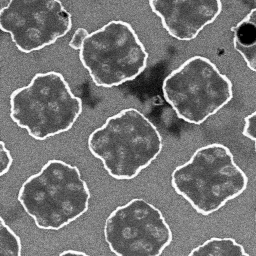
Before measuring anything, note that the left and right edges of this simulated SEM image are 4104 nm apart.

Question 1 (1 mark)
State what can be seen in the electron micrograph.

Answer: raised bodies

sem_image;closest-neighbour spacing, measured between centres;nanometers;1410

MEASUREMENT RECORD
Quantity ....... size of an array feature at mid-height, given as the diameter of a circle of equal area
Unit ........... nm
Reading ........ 1030